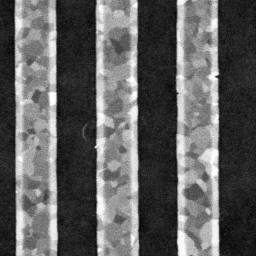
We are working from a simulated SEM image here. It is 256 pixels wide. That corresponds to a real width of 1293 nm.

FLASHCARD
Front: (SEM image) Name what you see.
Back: one or a few lines or trenches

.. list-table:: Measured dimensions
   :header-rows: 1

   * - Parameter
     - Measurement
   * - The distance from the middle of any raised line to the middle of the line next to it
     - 408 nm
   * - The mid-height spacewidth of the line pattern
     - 0.238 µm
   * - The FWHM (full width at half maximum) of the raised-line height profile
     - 170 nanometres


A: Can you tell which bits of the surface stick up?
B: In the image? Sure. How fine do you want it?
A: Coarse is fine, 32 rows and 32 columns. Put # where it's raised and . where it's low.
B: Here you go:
..#####......####......####.....
..#####......####......####.....
..#####......####......####.....
..#####......####......####.....
..#####......####......####.....
..#####.....#####......####.....
..#####......####......####.....
..#####......####......####.....
..#####......####......####.....
..#####......####......####.....
..#####.....#####......####.....
..#####......####......####.....
..####......#####......####.....
..#####......####......####.....
..#####......####......####.....
..#####......####......####.....
...####......####......####.....
...####.....#####......####.....
...####.....#####......####.....
...####......####......####.....
...####......####......####.....
...####......####......####.....
...####......####......####.....
...####......####......####.....
...####......####......####.....
..#####......####......####.....
..#####......####......####.....
...####......####......####.....
...####......####......####.....
..#####......####......####.....
...####......####......####.....
...####......####......####.....